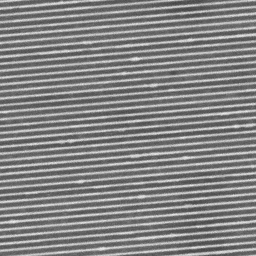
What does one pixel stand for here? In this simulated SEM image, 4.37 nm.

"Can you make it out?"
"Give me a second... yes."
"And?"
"parallel lines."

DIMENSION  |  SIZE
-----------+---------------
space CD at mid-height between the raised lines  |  19.6 nm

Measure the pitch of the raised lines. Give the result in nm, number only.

30.2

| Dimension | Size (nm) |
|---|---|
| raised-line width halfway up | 8.2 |